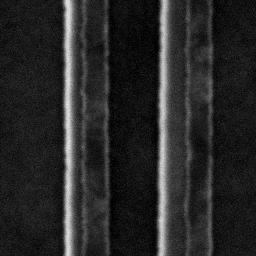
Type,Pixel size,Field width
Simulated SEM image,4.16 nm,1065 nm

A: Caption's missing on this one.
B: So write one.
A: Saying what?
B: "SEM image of lines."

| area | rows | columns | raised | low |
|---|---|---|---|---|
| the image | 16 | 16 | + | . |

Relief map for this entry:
....+++...+++...
....+++...+++...
....+++...+++...
....+++...+++...
....+++...+++...
....+++...+++...
....+++...+++...
....+++...+++...
....+++...+++...
....+++...+++...
....+++...+++...
....+++...+++...
....+++...+++...
....+++...+++...
....+++...+++...
....+++...+++...